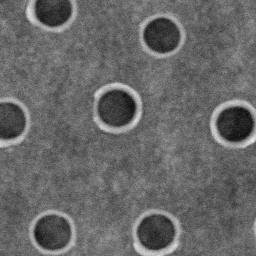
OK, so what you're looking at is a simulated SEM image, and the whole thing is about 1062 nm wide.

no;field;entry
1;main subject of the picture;holes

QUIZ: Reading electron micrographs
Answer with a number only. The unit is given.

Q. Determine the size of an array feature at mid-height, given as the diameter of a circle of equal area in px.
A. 40.3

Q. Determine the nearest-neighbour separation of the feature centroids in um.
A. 0.392